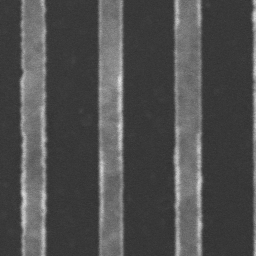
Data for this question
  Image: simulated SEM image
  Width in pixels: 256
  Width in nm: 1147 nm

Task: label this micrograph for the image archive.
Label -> one or a few lines or trenches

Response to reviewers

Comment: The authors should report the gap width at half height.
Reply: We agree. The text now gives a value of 53.5 px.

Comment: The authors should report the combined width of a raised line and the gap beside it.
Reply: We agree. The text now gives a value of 346 nm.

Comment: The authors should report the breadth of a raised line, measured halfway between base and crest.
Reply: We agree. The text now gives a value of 0.102 µm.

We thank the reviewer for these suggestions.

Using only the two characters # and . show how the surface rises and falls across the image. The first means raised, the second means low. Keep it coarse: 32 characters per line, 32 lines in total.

...###.......##.......###.......
...###.......##.......###.......
...##........##.......###.......
...###.......##.......###.......
...###.......##.......###.......
...###.......##.......###.......
...###.......##.......###.......
...###.......##.......###.......
...###.......##.......###.......
...###.......##.......###.......
...###.......##.......###.......
...###......###.......###.......
...###.......##.......###.......
...###......###.......###.......
...###.......##.......###.......
...###......###.......###.......
...###......###.......###.......
...###.......##.......###.......
...###......###.......###.......
...###......###.......###.......
...###......###.......###.......
...###......###.......###.......
...###......###.......###.......
...###.......##.......###.......
...###.......##.......###.......
...###.......##.......###.......
...###......###.......###.......
...##.......###.......###.......
...###.......##.......###.......
...###.......##.......###.......
...###.......##.......###.......
...###.......##.......###.......